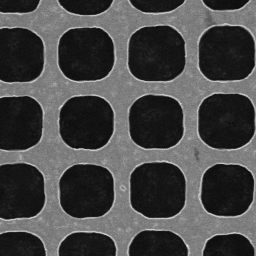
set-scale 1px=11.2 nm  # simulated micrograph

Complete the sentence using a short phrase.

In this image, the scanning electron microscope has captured a regular array of holes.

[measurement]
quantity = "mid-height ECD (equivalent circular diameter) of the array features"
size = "644 nanometres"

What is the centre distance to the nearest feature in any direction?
767 nm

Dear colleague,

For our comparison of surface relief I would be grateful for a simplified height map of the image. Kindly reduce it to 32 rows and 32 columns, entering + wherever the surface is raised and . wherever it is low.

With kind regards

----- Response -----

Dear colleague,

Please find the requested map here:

.....+++......+++......+++.....+
....+++++....+++++...+++++++++++
++++++++++++++++++++++++++++++++
++.+++++++..++++++....++++....++
.....+++......++.......++......+
.....++.......++.......++.......
.....++.......++.......++.......
.....++.......++.......++.......
.....++.......++.......++.......
.....+++.....++++.....++++.....+
++++++++++++++++++++++++++++++++
++++++++++++++++++++++++++++++++
....+++++....++++.....++++.....+
.....+++......++.......++.......
.....++.......++.......++.......
.....++.......++.......++.......
.....+++......++.......++.......
.....+++......+++.....+++......+
....+++++...++++++...++++++...++
++++++++++++++++++++++++++++++++
+..+++++++++++++++....++++++++++
.....+++......+++......+++.....+
.....+++......++.......++.......
......+.......++.......++.......
......+.......++.......++.......
.....+++......++.......++......+
.....+++.....++++.....++++.....+
++++++++++++++++++++++++++++++++
++++++++++++++++++++++++++++++++
....++++.....++++.....+++++...++
.....+++......++.......+++.....+
......+.......++.......++.......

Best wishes